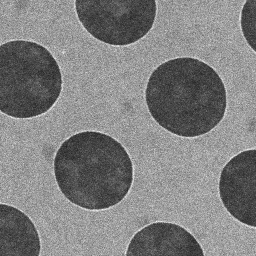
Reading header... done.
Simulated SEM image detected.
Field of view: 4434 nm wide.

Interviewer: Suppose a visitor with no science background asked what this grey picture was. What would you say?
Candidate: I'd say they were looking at holes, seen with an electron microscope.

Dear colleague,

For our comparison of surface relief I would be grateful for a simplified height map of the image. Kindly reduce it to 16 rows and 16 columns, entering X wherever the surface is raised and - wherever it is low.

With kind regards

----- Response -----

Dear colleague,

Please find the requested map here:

XXXXX-----XXXXX-
XXXXX-----XXXXX-
XXXXXX---XXXXXX-
---XXXXXXXXXXXXX
----XXXXXX---XXX
----XXXXX-----XX
---XXXXXX-----XX
XXXXXXXXXX----XX
XXXXX--XXXX-XXXX
XXXX----XXXXXXX-
XXX-----XXXXXX--
XXXX----XXXXXX--
XXXX----XXXXXX--
--XXXXXXXXXXXXX-
--XXXXXXX---XXXX
--XXXXXX-----XXX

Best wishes